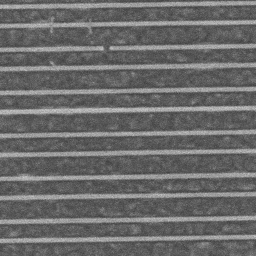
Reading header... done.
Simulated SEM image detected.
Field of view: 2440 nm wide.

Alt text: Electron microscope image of parallel lines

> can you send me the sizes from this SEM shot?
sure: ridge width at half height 38.1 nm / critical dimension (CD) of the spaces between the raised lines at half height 0.143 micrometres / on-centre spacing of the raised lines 21.3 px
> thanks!